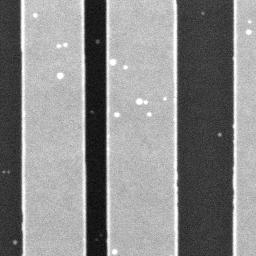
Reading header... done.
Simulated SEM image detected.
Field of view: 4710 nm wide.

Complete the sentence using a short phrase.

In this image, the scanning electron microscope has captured lines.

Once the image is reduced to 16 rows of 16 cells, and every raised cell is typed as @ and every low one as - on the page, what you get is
-@@@@--@@@@----@
-@@@@--@@@@----@
-@@@@--@@@@----@
-@@@@--@@@@----@
-@@@@--@@@@----@
-@@@@--@@@@----@
-@@@@--@@@@----@
-@@@@--@@@@----@
-@@@@--@@@@----@
-@@@@--@@@@----@
-@@@@--@@@@----@
-@@@@--@@@@----@
-@@@@--@@@@----@
-@@@@--@@@@----@
-@@@@--@@@@----@
-@@@@--@@@@----@